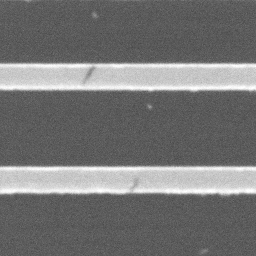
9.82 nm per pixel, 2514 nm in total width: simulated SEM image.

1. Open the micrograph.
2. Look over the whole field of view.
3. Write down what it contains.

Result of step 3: lines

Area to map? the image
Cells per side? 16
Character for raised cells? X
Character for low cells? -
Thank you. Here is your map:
----------------
----------------
----------------
----------------
XXXXXXXXXXXXXXXX
XXX-XXXXXXXXXXXX
----------------
----------------
----------------
----------------
XXXXXXXXXXXXXXXX
XXXXXXXXXXXXXXXX
----------------
----------------
----------------
----------------